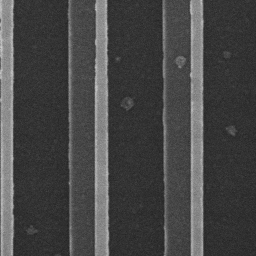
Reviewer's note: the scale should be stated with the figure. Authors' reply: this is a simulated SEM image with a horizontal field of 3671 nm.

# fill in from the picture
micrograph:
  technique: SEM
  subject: lines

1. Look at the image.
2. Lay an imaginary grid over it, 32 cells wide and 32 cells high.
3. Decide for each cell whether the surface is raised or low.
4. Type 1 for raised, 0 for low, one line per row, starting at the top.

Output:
11000000011110000000111110000000
11000000011110000000111110000000
11000000011110000000111110000000
11000000011110000000111110000000
11000000011110000000111110000000
11000000011110000000011110000000
11000000011110000000011110000000
11000000011110000000011110000000
11000000011110000000011110000000
11000000011110000000011110000000
11000000011110000000011110000000
11000000011110000000011110000000
11000000011110000000011110000000
11000000011110000000011110000000
11000000011110000000011110000000
11000000011110000000011110000000
11000000011110000000011110000000
11000000011110000000011110000000
11000000011110000000011110000000
11000000011110000000011110000000
11000000011110000000011110000000
11000000011110000000011110000000
11000000011110000000011110000000
11000000011110000000011110000000
11000000011110000000011110000000
11000000011110000000011110000000
11000000011110000000011110000000
11000000011110000000011110000000
11000000011110000000011110000000
11000000011111000000011110000000
11000000011110000000011110000000
11000000011111000000011110000000